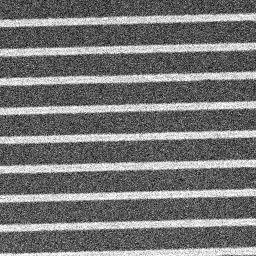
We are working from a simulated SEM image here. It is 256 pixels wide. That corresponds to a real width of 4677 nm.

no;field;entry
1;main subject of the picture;parallel lines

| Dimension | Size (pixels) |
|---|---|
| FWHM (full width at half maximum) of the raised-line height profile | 6.25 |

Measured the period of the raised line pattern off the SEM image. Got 534 nanometers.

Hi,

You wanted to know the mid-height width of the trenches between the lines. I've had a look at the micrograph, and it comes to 23.4 px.